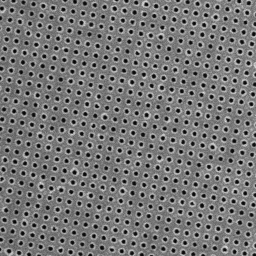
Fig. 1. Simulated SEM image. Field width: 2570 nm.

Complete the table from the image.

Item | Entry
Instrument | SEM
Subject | a regular array of holes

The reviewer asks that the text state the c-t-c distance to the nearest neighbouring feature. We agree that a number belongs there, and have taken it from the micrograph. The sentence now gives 97.7 nanometers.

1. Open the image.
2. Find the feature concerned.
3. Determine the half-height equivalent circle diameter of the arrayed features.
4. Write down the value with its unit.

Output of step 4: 45.3 nm